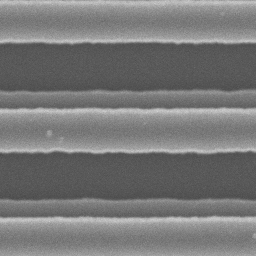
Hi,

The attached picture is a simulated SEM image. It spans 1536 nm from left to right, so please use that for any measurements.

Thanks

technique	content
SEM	lines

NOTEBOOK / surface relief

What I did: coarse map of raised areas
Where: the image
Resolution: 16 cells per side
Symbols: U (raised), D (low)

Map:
UUUUUUUUUUUUUUUU
UUUUUUUUUUUUUUUU
UUUUUUUUUUUUUUUU
DDDDDDDDDDDDDDDD
DDDDDDDDDDDDDDDD
DDDDDDDDDDDDDDDD
UUUUUUUUUUUUUUUU
UUUUUUUUUUUUUUUU
UUUUUUUUUUUUUUUU
UUUDUUUUUUUUUUDD
DDDDDDDDDDDDDDDD
DDDDDDDDDDDDDDDD
DDDDDDDDDDDDDDDD
UUUUUUUUUUUUUUUU
UUUUUUUUUUUUUUUU
UUUUUUUUUUUUUUUU